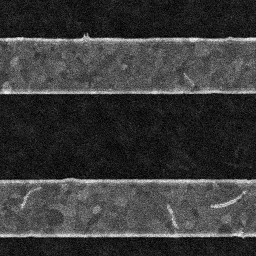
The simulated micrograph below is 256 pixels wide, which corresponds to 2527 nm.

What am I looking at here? one or a few lines or trenches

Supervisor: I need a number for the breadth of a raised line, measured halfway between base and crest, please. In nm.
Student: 530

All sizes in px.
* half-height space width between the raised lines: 88.7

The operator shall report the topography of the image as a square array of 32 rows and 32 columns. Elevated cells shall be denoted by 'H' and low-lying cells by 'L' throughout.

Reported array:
LLLLLLLLLLLLLLLLLLLLLLLLLLLLLLLL
LLLLLLLLLLLLLLLLLLLLLLLLLLLLLLLL
LLLLLLLLLLLLLLLLLLLLLLLLLLLLLLLL
LLLLLLLLLLLLLLLLLLLLLLLLLLLLLLLL
LLLLLLLLLLLLLLLLLLLLLLLLLLLLLLLL
HHHHHHHHHHHHHHHHHHHHHHHHHHHHHHHH
HHHHHHHHHHHHHHHHHHHHHHHHHHHHHHHH
HHHHHHHHHHHHHHHHHHHHHHHHHHHHHHHH
HHHHHHHHHHHHHHHHHHHHHHHHHHHHHHHH
HHHHHHHHHHHHHHHHHHHHHHHHHHHHHHHH
HHHHHHHHHHHHHHHHHHHHHHHHHHHHHHHH
HLLLLLLLLLLLLHLLLLLLLLLLLLLLLLLL
LLLLLLLLLLLLLLLLLLLLLLLLLLLLLLLL
LLLLLLLLLLLLLLLLLLLLLLLLLLLLLLLL
LLLLLLLLLLLLLLLLLLLLLLLLLLLLLLLL
LLLLLLLLLLLLLLLLLLLLLLLLLLLLLLLL
LLLLLLLLLLLLLLLLLLLLLLLLLLLLLLLL
LLLLLLLLLLLLLLLLLLLLLLLLLLLLLLLL
LLLLLLLLLLLLLLLLLLLLLLLLLLLLLLLL
LLLLLLLLLLLLLLLLLLLLLLLLLLLLLLLL
LLLLLLLLLLLLLLLLLLLLLLLLLLLLLLLL
LLLLLLLLLLLLLLLLLLLLLLLLLLLLLLLL
LLLLLLLLHLLLLLLLLLLLLLLLLLLLLLLL
HHHHHHHHHHHHHHHHHHHHHHHHHHHHHHHH
HHHHHHHHHHHHHHHHHHHHHHHHHHHHHHHH
HHHHHHHHHHHHHHHHHHHHHHHHHHHHHHHH
HHHHHHHHHHHHHHHHHHHHHHHHHHHHHHHH
HHHHHHHHHHHHHHHHHHHHHHHHHHHHHHHH
HHHHHHHHHHHHHHHHHHHHHHHHHHHHHHHH
LLLLLLLLLLLLLLLLLLLLLLLLLLLLLLLL
LLLLLLLLLLLLLLLLLLLLLLLLLLLLLLLL
LLLLLLLLLLLLLLLLLLLLLLLLLLLLLLLL